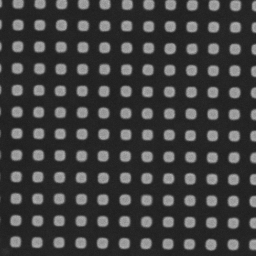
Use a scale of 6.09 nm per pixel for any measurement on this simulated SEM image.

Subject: a regular array of raised bodies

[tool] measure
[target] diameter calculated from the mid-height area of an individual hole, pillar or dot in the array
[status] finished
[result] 11.3 pixels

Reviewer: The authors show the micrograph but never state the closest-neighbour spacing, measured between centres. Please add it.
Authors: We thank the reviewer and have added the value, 130 nanometers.